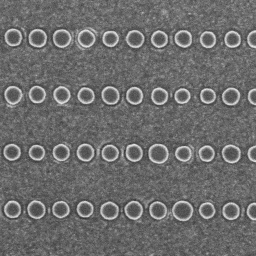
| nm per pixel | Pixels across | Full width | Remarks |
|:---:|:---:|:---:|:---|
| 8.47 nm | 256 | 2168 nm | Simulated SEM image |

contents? a regular array of raised bodies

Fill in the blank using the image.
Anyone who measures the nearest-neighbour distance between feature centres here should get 0.204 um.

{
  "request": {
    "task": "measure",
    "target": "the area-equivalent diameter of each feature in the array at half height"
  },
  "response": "0.139 um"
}